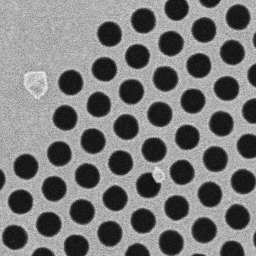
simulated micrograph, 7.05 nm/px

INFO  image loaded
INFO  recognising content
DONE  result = a regular array of holes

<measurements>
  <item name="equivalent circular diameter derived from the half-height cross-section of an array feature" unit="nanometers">168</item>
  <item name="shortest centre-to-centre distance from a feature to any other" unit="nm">250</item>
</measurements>